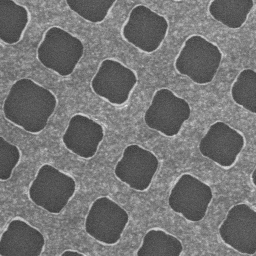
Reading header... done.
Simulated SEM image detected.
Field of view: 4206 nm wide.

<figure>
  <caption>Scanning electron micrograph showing a regular array of holes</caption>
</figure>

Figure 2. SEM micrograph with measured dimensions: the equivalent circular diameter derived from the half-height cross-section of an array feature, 713 nm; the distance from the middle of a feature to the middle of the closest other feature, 1010 nm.